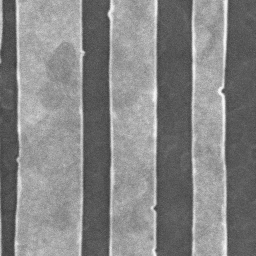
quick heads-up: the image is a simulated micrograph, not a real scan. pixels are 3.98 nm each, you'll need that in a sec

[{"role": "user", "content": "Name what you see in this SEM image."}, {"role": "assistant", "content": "one or a few lines or trenches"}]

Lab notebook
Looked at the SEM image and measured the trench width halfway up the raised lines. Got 121 nanometres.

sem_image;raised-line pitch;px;79.5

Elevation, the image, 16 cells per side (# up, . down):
.####..###..##..
.####..###..##..
.####..###..##..
.####..###..##..
.####..###..##..
.####..###..##..
.####..###..##..
.####..###..##..
.####..###..##..
.####..###..##..
.####..###..##..
.####..###..##..
.####..###..##..
.####..###..##..
.####..###..##..
.####..###..##..